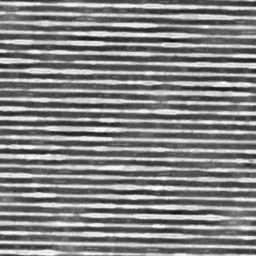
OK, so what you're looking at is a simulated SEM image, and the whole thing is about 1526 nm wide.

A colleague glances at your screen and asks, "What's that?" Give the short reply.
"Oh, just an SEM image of parallel lines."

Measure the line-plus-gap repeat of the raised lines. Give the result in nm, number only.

56.9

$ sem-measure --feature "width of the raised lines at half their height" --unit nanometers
17.9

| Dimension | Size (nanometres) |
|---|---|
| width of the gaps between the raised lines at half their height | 35.7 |